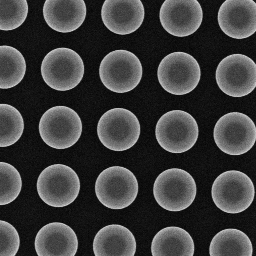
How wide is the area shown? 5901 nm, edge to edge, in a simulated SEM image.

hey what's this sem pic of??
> an array of small figures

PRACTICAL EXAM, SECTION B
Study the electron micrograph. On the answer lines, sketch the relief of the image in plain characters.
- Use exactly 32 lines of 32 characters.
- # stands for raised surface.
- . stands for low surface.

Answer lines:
###...#####..#####..#####...####
###..######..#####..#####..#####
###...####...#####..#####..#####
##....####....###....####...####
......................#......##.
................................
##....###.....##................
###..#####...####...####....###.
###..#####...#####..#####..#####
###..#####...#####..#####..#####
##....####...####...#####..#####
..............##.....###....###.
................................
##.....#........................
###..#####...####...####....###.
###..#####..#####...#####..#####
###..#####..#####...#####..#####
##...#####...####...#####..#####
.......#.....###....####...####.
................................
#...............................
##...####....###....###.....##..
###..#####..#####...####...####.
###..#####..#####..#####...#####
##...#####..#####..#####...#####
#.....###....###....####...####.
............................##..
................................
##...####....###.....#..........
##...####...#####..#####...####.
##..######..#####..#####..#####.
##...#####..#####..#####..######